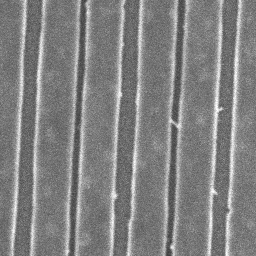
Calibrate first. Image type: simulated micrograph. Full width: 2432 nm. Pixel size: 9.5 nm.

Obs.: parallel lines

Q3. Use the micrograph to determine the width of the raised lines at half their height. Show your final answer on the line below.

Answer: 348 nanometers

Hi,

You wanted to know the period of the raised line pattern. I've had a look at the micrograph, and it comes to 451 nanometers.